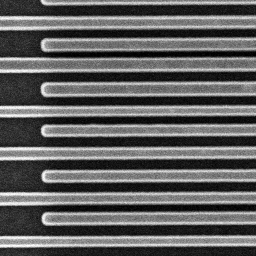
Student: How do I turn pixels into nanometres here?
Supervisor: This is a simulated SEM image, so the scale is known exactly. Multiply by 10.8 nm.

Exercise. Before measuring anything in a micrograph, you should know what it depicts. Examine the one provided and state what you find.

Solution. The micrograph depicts parallel lines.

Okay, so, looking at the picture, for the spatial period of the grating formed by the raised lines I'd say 21.9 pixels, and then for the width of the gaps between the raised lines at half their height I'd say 0.123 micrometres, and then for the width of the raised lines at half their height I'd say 123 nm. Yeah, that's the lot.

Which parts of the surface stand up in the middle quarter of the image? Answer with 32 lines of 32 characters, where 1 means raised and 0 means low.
11111111111111111111111111111111
11111111111111111111111111111110
00000000000000000000000000000000
00000000000000000000000000000000
00000000000000000000000000000000
11111111111111111111111111111111
11111111111111111111111111111111
11111111111111111111111111111111
00000000000000000000000000000000
00000000000000000000000000000000
00000000000000000000000000000000
11111111111111111111111111111111
11111111111111111111111111111111
00000000000000000000000000000000
00000000000000000000000000000000
00011111111111111111111111111111
11111111111111111111111111111111
11111111111111111111111111111111
00000000000000000000000000000000
00000000000000000000000000000000
00000000000000000000000000000000
11111111111111111111111111111111
11111111111111111111111111111111
11111111111111111111111111111000
00000000000000000000000000000000
00000000000000000000000000000000
00000000000000000000000000000000
11111111111111111111111111111111
11111111111111111111111111111111
00000000000000000000000000000000
00000000000000000000000000000000
00000000000000000000000000000000